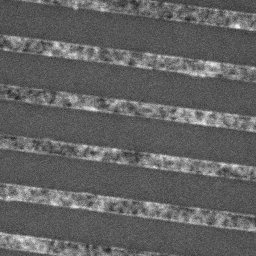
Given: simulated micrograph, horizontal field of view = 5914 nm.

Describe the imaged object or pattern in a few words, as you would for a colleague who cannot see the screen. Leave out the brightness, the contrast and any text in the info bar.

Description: parallel lines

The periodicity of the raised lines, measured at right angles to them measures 1140 nm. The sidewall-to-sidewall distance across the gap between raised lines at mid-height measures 836 nm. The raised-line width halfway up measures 13.4 px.